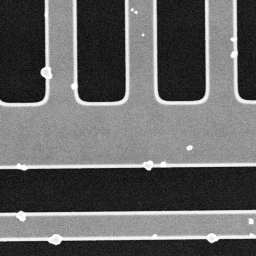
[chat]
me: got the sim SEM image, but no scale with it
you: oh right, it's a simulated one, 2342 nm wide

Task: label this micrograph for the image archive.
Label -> groups of lines, slits or small figures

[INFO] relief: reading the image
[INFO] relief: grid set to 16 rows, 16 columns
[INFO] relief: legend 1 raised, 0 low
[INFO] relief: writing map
0001100011000110
0001100011000110
0001100011000110
0001100011000110
0001100011000110
0001100011000110
1011111111111111
1111111111111111
1111111111111111
1111111111111111
0100000000000000
0000000000000000
0000000000000000
1111111111111111
1111111111111111
0000000000000000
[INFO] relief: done